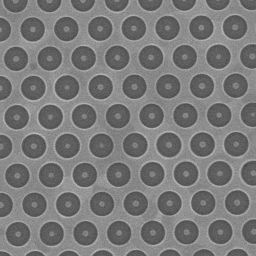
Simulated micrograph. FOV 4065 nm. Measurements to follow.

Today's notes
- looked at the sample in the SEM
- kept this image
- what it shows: an array of small figures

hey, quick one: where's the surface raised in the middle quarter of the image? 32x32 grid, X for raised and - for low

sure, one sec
XX-----XXXX-----XXX-----XXXX----
XXXX--XXXXXXX-XXXXXXX-XXXXXXXXXX
XXXXXXXXXXXXXXXXXXXXXXXXXXXXXXXX
---XXXX----XXXX-----XXXX----XXXX
----XX------XXX-----XXX------XXX
----XX---X--XX---X---XX--XX--XX-
----XX------XXX------XX------XXX
----XX------XXX-----XXXX----XXXX
---XXXX----XXXXX---XXXXXX--XXXXX
XXXXXXXXXXXXXXXXXXXXXXXXXXXXXXXX
XXX----XXXXX---XXXXX----XXXX----
XX------XXX-----XXX------XX-----
XX------XX-------XX------XX---X-
XX------XX-------XX------XX-----
XX------XXX-----XXX------XXX----
XXX----XXXXX---XXXXX----XXXXX---
XXXXXXXXXXXXXXXXXXXXXXXXXXXXXXXX
--XXXXXX--XXXXXX---XXXXX----XXXX
---XXXX-----XXX-----XXX------XXX
----XX------XXX------XX-------X-
----XX------XXX--X---XX---X---X-
----XX------XXX------XX------XXX
---XXXX-----XXXX----XXXX-----XXX
--XXXXXXX-XXXXXXXXXXXXXXXX-XXXXX
XXXXXXXXXXXXXXXXXXXXX--XXXXXX---
XXX----XXXX-----XXXX-----XXX----
XX------XXX-----XXX------XX-----
XX------XX---X---XX---X--XX---X-
XX------XXX------XX------XXX----
XXX-----XXX-----XXXX----XXXX----
XXXX---XXXXX---XXXXXX--XXXXXX--X
XXXXXXXXXXXXXXXXXXXXXXXXXXXXXXXX